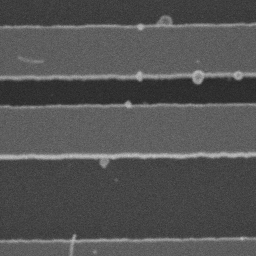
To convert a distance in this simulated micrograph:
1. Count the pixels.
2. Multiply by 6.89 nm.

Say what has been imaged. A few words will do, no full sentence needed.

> lines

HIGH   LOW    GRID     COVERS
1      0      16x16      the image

0000000000000000
0000000000000011
1111111111111111
1111111111111111
1111111111111111
0000000000000000
0000000100000000
1111111111111111
1111111111111111
1111111111111111
0000000000000000
0000000000000000
0000000000000000
0000000000000000
0000000000000000
1111111111111111